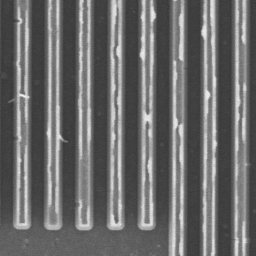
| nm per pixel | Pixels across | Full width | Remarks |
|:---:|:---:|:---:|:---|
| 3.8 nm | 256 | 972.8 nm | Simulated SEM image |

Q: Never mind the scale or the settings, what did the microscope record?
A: parallel lines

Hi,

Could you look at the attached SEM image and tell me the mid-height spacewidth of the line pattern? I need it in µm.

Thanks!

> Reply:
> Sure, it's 0.0669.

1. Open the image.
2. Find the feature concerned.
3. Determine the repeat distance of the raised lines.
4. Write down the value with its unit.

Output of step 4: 118 nanometres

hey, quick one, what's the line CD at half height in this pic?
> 51.7 nm